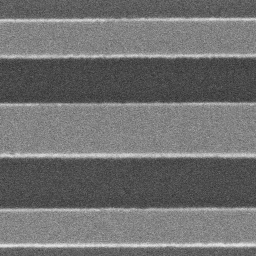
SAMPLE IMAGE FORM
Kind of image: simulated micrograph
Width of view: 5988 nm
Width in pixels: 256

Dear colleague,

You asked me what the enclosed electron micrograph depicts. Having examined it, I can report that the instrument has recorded lines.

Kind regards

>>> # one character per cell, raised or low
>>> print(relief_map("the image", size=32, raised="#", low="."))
................................
................................
...........................#.###
################################
################################
################################
################################
................................
................................
................................
................................
................................
................................
################################
################################
################################
################################
################################
################################
................................
................................
................................
................................
................................
................................
................................
################################
################################
################################
################################
################################
................................